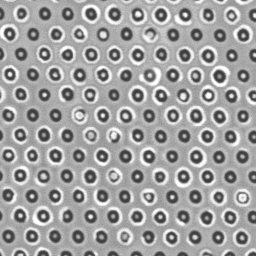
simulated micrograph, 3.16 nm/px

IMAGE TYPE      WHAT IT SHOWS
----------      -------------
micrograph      a regular array of ring-shaped grooves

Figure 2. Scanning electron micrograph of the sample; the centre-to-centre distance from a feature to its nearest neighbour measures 72.1 nanometres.